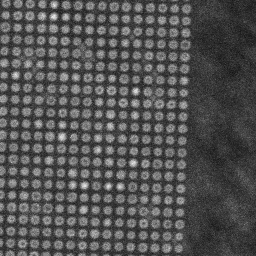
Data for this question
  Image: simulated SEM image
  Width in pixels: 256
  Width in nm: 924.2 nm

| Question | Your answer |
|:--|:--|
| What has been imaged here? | a regular array of raised bodies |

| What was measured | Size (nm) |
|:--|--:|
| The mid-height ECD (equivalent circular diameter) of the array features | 29.1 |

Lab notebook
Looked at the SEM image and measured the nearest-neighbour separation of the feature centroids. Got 0.0427 µm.